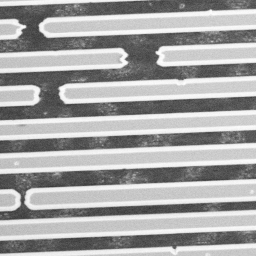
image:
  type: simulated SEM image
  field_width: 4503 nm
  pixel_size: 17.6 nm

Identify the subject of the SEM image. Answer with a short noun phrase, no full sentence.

parallel lines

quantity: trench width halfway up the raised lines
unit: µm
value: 0.319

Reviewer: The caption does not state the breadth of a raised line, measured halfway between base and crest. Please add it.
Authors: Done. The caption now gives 286 nm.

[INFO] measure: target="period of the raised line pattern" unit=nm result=588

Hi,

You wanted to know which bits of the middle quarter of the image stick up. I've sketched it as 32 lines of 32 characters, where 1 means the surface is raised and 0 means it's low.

11111111110000000000000000000000
00000000000000000000000000000000
00000000000000000000000000000000
00000000000000000000000000000000
00000000000000000000000000000011
00001111111111111111111111111111
11111111111111111111111111111111
11111111111111111111111111111111
11111111111111111110000000000000
00000000000000000000000000000000
00000000000000000000000000000000
00000000000000000000000000000000
00000000000000000000000000000000
00000000000001111111111111111111
11111111111111111111111111111111
11111111111111111111111111111111
11111111111111111111111111111111
11111111100000000000000000000000
00000000000000000000000000000000
00000000000000000000000000000000
00000000000000000000000000000000
00000000000000000000001111111111
11111111111111111111111111111111
11111111111111111111111111111111
11111111111111111111111111111111
11111111111111111100000000000000
00000000000000000000000000000000
00000000000000000000000000000000
00000000000000000000000000000000
00000000000000000000000000000000
00000000000000000000000011111111
11111111111111111111111111111111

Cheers